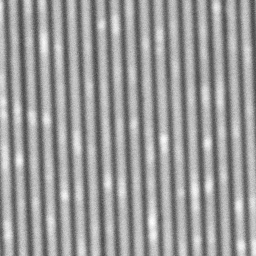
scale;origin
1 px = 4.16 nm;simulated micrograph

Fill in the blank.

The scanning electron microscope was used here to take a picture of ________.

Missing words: parallel lines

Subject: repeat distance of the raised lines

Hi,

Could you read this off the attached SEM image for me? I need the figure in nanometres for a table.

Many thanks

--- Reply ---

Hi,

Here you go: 60.3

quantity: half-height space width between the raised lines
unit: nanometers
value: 28.5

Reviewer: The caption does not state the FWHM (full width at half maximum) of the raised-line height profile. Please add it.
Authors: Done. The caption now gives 31.7 nm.